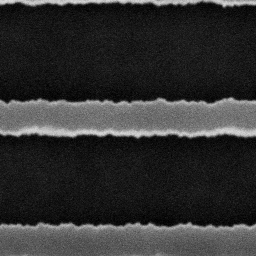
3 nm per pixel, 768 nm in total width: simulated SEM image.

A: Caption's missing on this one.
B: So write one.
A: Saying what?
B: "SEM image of lines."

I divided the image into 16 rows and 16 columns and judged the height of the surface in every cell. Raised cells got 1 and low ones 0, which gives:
0000000000000000
0000000000000000
0000000000000000
0000000000000000
0000000000000000
0000000000000000
1111111111111111
1111111111111111
0000000000000000
0000000000000000
0000000000000000
0000000000000000
0000000000000000
0000000000000000
1111111111111111
1111111111111111